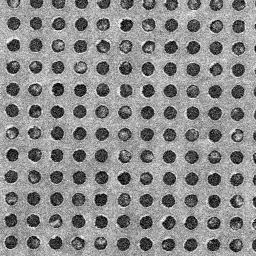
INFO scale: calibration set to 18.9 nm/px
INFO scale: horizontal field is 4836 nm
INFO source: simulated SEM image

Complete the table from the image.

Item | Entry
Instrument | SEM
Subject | a regular array of holes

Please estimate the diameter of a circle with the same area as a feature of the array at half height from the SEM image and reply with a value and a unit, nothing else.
0.26 microns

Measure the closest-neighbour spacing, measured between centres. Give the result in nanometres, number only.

410